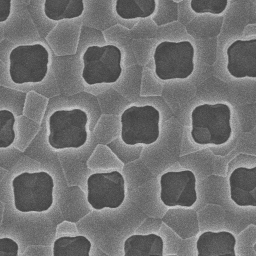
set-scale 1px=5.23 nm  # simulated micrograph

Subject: a regular array of holes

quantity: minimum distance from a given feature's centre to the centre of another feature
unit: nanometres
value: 375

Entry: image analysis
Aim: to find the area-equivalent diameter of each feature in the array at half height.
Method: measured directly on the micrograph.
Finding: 0.214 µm